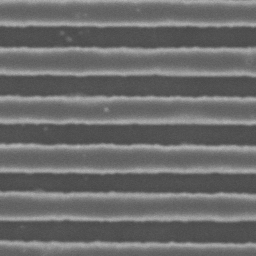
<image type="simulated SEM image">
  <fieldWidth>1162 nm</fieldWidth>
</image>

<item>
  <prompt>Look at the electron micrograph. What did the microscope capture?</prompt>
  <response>lines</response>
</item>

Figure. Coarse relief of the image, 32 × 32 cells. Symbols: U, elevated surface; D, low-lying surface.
UUUUUUUUUUUUUUUUUUUUUUUUUUUUUUUU
UUUUUUUUUUUUUUUUUUUUUUUUUUUUUUUU
UUUUUUUUUUUUUUUUUUUUUUUUUUUUUUUU
DDDDDDDDDDDDDDDDDDDDDDDDDDDDDDDD
DDDDDDDDDDDDDDDDDDDDDDDDDDDDDDDD
DDDDDDDDDDDDDDDDDDDDDDDDDDDDDDDD
UUUUUUUUUUUUUUUUUUUUUUUUUUUUUUUU
UUUUUUUUUUUUUUUUUUUUUUUUUUUUUUUU
UUUUUUUUUUUUUUUUUUUUUUUUUUUUUUUU
DDDDDDDDDDDDDDDDDDDDDDDDDDDDDDDD
DDDDDDDDDDDDDDDDDDDDDDDDDDDDDDDD
DDDDDDDDDDDDDDDDDDDDDDDDDDDDDDDD
UUUUUUUUUUUUUUUUUUUUUUUUUUUUUUUU
UUUUUUUUUUUUUUUUUUUUUUUUUUUUUUUU
UUUUUUUUUUUUUUUUUUUUUUUUUUUUUUUU
DDDDDDDDDDDDDDDDDDDDDDDDDDDDDDDD
DDDDDDDDDDDDDDDDDDDDDDDDDDDDDDDD
DDDDDDDDDDDDDDDDDDDDDDDDDDDDDDDD
UUUUUUUUUUUUUUUUUUUUUUUUUUUUUUUU
UUUUUUUUUUUUUUUUUUUUUUUUUUUUUUUU
UUUUUUUUUUUUUUUUUUUUUUUUUUUUUUUU
UDUUUUUUUUUUUUUUUUUUUUUUUUUUUUUU
DDDDDDDDDDDDDDDDDDDDDDDDDDDDDDDD
DDDDDDDDDDDDDDDDDDDDDDDDDDDDDDDD
UUUUUUUUUUUUUUUUUUUUUUUUUUUUUUUU
UUUUUUUUUUUUUUUUUUUUUUUUUUUUUUUU
UUUUUUUUUUUUUUUUUUUUUUUUUUUUUUUU
UUUUUDDDDUUUUUUUUUUUUUUUUDUUUUUD
DDDDDDDDDDDDDDDDDDDDDDDDDDDDDDDD
DDDDDDDDDDDDDDDDDDDDDDDDDDDDDDDD
UUUUUUUUUUUUUUUUUUUUUUUUUDUUUDDU
UUUUUUUUUUUUUUUUUUUUUUUUUUUUUUUU